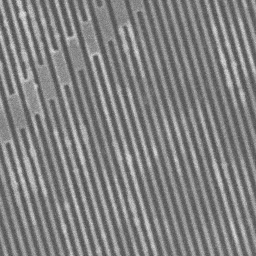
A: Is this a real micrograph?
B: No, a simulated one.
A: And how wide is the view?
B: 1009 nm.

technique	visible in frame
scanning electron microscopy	parallel lines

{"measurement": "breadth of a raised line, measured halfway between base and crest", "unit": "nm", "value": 10.5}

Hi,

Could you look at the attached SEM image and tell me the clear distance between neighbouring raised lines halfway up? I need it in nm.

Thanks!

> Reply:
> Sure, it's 23.7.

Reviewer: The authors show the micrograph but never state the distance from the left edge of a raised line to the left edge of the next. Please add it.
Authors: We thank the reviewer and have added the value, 35.5 nm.